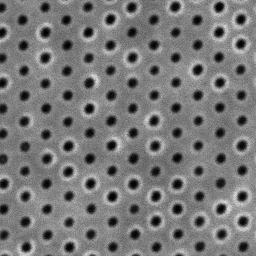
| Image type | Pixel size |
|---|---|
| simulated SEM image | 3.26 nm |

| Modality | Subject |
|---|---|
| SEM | a regular array of holes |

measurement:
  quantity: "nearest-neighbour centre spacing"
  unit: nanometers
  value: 80.4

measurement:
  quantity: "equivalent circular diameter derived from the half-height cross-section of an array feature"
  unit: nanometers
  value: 35.3